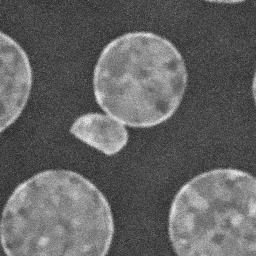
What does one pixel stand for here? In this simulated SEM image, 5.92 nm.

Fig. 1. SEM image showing raised bodies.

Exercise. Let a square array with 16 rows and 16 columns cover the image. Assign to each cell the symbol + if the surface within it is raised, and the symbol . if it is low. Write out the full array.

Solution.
................
................
+......+++......
++....+++++.....
++....++++++....
++....++++++....
++....+++++.....
+....+++++......
.....+++........
................
................
..++++......++++
.++++++....+++++
+++++++....+++++
+++++++....+++++
+++++++....+++++